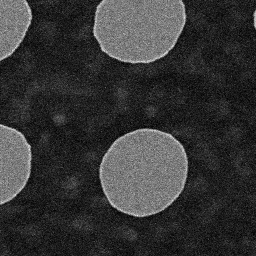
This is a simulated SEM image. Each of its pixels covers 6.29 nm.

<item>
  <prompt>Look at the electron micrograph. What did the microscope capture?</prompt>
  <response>raised bodies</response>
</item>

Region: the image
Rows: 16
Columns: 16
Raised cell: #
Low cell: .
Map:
##....######....
##....#####.....
#.....#####.....
.......###......
................
................
................
................
#.......###.....
##.....#####....
##....######....
##....######....
#......####.....
................
................
................